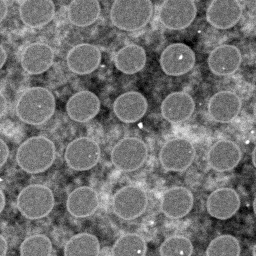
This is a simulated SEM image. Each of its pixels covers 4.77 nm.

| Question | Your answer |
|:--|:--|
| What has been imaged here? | a regular array of raised bodies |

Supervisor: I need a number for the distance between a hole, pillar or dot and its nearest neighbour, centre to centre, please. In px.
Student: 46.6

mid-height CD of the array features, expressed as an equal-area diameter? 152 nanometres